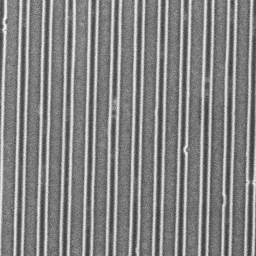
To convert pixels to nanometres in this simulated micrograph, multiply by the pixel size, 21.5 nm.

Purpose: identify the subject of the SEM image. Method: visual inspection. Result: parallel lines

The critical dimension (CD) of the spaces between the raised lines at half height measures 0.32 µm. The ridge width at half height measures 169 nm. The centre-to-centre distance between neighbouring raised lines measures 496 nm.